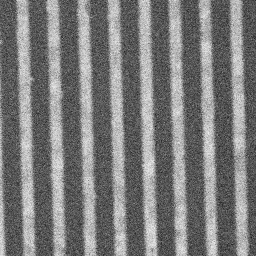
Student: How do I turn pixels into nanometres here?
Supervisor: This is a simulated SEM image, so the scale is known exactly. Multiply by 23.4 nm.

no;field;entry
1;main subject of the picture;parallel lines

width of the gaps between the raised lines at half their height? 0.469 microns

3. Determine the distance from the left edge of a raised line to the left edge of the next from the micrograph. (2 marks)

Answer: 713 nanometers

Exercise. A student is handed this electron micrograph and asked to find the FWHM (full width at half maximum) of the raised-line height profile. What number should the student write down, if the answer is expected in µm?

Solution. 0.243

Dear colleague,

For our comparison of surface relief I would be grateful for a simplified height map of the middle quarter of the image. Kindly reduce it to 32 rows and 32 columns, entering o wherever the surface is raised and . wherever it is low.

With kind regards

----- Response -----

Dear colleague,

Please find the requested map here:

....oo......oo.....ooo.....oo...
....oo......oo.....ooo.....oo...
....ooo.....oo.....ooo.....oo...
....ooo.....oo.....ooo.....oo...
....ooo.....oo.....ooo.....oo...
....ooo.....oo.....ooo.....oo...
....ooo.....oo.....ooo.....oo...
....ooo.....oo.....ooo.....oo...
....ooo.....oo.....ooo.....ooo..
....ooo.....oo......oo.....ooo..
....ooo.....oo......oo.....ooo..
....ooo.....oo......oo.....ooo..
....ooo.....oo......oo.....ooo..
....ooo.....oo......oo.....ooo..
....ooo.....ooo.....oo.....ooo..
.....oo.....ooo.....oo.....ooo..
.....oo.....ooo.....oo.....ooo..
.....oo.....ooo.....oo.....ooo..
.....oo.....ooo.....oo.....ooo..
.....oo.....ooo.....oo.....ooo..
.....oo.....ooo.....oo......oo..
.....oo.....ooo.....oo.....ooo..
.....oo.....ooo.....oo......oo..
.....oo.....ooo.....oo......o...
.....oo.....ooo.....oo......oo..
.....oo.....ooo.....oo......oo..
.....oo.....ooo.....oo......oo..
.....oo.....ooo.....oo......oo..
.....oo.....ooo.....oo......oo..
.....oo.....ooo.....ooo.....oo..
.....oo......oo.....ooo.....oo..
.....oo......oo.....ooo.....oo..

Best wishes